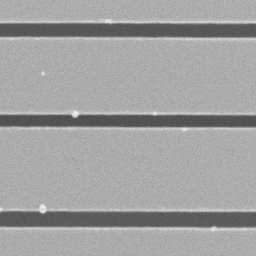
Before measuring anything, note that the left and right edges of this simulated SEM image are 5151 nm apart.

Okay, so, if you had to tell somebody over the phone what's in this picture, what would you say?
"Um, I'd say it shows lines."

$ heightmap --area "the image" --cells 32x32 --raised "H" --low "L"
HHHHHHHHHHHHHHHHHHHHHHHHHHHHHHHH
HHHHHHHHHHHHHHHHHHHHHHHHHHHHHHHH
HHHHHHHHHHHHHHHHHHHHHHHHHHHHHHHH
LLLLLLLLLLLLLLLLLLLLLLLLLLLLLLLL
LLLLLLLLLLLLLLLLLLLLLLLLLLLLLLLL
HHHHHHHHHHHHHHHHHHHHHHHHHHHHHHHH
HHHHHHHHHHHHHHHHHHHHHHHHHHHHHHHH
HHHHHHHHHHHHHHHHHHHHHHHHHHHHHHHH
HHHHHHHHHHHHHHHHHHHHHHHHHHHHHHHH
HHHHHHHHHHHHHHHHHHHHHHHHHHHHHHHH
HHHHHHHHHHHHHHHHHHHHHHHHHHHHHHHH
HHHHHHHHHHHHHHHHHHHHHHHHHHHHHHHH
HHHHHHHHHHHHHHHHHHHHHHHHHHHHHHHH
HHHHHHHHHHHHHHHHHHHHHHHHHHHHHHHH
LLLLLLLLLLLLLLLLLLLLLLLLLLLLLLLL
LLLLLLLLLLLLLLLLLLLLLLLLLLLLLLLL
HHHHHHHHHHHHHHHHHHHHHHHHHHHHHHHH
HHHHHHHHHHHHHHHHHHHHHHHHHHHHHHHH
HHHHHHHHHHHHHHHHHHHHHHHHHHHHHHHH
HHHHHHHHHHHHHHHHHHHHHHHHHHHHHHHH
HHHHHHHHHHHHHHHHHHHHHHHHHHHHHHHH
HHHHHHHHHHHHHHHHHHHHHHHHHHHHHHHH
HHHHHHHHHHHHHHHHHHHHHHHHHHHHHHHH
HHHHHHHHHHHHHHHHHHHHHHHHHHHHHHHH
HHHHHHHHHHHHHHHHHHHHHHHHHHHHHHHH
HHHHHHHHHHHHHHHHHHHHHHHHHHHHHHHH
LLLLLHLLLLLLLLLLLLLLLLLLLLLLLLLL
LLLLLLLLLLLLLLLLLLLLLLLLLLLLLLLL
HHHHHHHHHHHHHHHHHHHHHHHHHHHHHHHH
HHHHHHHHHHHHHHHHHHHHHHHHHHHHHHHH
HHHHHHHHHHHHHHHHHHHHHHHHHHHHHHHH
HHHHHHHHHHHHHHHHHHHHHHHHHHHHHHHH